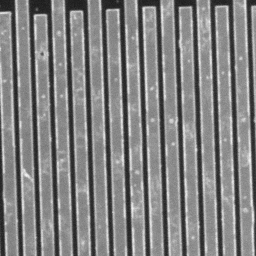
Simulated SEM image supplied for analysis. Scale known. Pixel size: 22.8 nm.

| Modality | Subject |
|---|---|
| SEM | parallel lines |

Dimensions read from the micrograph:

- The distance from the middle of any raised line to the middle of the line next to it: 413 nm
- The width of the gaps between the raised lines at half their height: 137 nanometres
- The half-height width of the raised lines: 273 nanometres